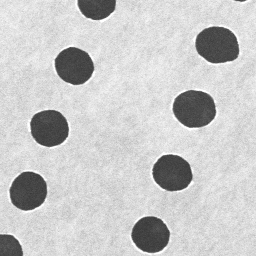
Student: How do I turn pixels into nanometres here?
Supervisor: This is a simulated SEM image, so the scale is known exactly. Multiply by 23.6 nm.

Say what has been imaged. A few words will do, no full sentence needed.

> holes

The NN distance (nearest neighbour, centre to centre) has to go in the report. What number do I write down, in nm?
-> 1560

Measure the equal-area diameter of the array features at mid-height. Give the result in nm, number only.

919